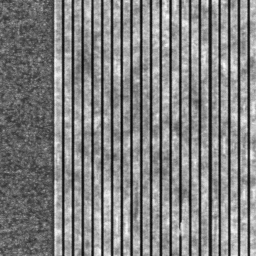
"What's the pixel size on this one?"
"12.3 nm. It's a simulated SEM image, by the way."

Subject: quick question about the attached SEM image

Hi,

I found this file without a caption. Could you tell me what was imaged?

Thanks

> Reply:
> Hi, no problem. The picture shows parallel lines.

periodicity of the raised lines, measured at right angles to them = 120 nm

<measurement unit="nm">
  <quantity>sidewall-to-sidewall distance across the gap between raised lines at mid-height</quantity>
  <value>24.6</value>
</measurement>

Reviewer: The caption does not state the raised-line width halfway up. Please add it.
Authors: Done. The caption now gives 95.3 nanometers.